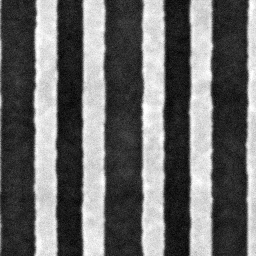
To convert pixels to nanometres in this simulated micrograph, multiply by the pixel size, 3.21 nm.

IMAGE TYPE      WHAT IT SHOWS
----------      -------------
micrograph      lines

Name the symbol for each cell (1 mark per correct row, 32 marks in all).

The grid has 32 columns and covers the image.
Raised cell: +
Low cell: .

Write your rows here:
.....++....++.....++....++.....+
.....++....++.....++....++.....+
.....++....++.....++....++.....+
.....++....++.....++....++.....+
.....++....++.....++....++.....+
.....++....++.....++....++.....+
.....++....++.....++....++.....+
.....++....++.....++....++.....+
.....++....++.....++....++.....+
.....++....++.....++....++.....+
.....++....++.....++....++.....+
....+++...+++.....++....++.....+
....+++....++.....++....++.....+
....+++...+++.....++....++.....+
.....++...+++.....++....++.....+
.....++....++.....++....++.....+
.....++...+++.....++....++.....+
.....++...+++.....++....++.....+
.....++...+++.....++....++.....+
.....++....++.....++....++.....+
.....++....++.....++....++.....+
.....++....++.....++....++.....+
.....++....++.....++....++.....+
....+++...+++.....++....++.....+
.....++....++.....++....++.....+
.....++...+++.....++....++.....+
.....++...+++.....++....++.....+
.....++...+++.....++....++.....+
.....++...+++.....++....++.....+
.....++....++.....++....++.....+
.....++....++.....++....++.....+
.....++....++.....++....++.....+